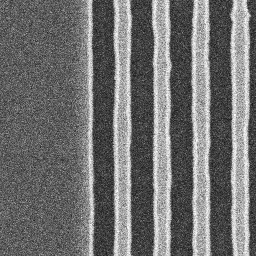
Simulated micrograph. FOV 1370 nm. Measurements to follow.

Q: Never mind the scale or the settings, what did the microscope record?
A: parallel lines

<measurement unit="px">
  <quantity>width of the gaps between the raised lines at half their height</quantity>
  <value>24.7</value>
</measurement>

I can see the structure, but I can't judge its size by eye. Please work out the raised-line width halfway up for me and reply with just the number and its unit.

14.6 pixels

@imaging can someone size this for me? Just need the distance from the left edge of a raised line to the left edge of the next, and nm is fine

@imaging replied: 210